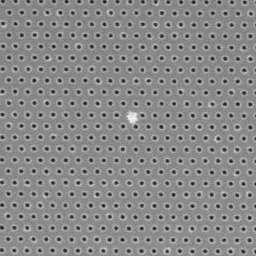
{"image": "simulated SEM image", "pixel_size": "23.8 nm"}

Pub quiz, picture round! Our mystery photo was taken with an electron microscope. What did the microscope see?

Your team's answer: a regular array of holes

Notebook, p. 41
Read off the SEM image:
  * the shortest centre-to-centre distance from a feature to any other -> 300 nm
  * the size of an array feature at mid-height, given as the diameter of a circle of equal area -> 0.111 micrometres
